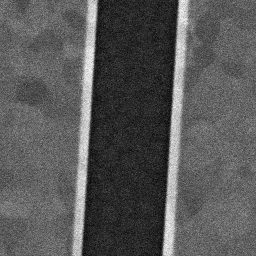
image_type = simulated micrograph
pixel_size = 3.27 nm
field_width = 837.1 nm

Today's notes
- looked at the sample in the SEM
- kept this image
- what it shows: one or a few lines or trenches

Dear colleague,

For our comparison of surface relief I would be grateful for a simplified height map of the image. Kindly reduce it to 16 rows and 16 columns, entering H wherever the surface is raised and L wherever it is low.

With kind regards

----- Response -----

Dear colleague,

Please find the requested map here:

HHHHHHLLLLLHHHHH
HHHHHHLLLLLHHHHH
HHHHHHLLLLLHHHHH
HHHHHHLLLLLHHHHH
HHHHHHLLLLLHHHHH
HHHHHHLLLLLHHHHH
HHHHHLLLLLLHHHHH
HHHHHLLLLLLHHHHH
HHHHHLLLLLLHHHHH
HHHHHLLLLLLHHHHH
HHHHHLLLLLLHHHHH
HHHHHLLLLLLHHHHH
HHHHHLLLLLLHHHHH
HHHHHLLLLLLHHHHH
HHHHHLLLLLLHHHHH
HHHHHLLLLLHHHHHH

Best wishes